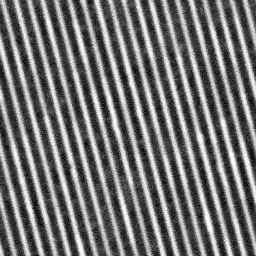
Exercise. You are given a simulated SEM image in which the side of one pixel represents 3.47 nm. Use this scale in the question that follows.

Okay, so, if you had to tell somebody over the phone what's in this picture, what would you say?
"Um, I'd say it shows parallel lines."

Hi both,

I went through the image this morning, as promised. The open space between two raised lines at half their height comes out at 35.2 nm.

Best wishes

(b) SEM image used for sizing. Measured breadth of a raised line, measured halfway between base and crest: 9.7 nanometers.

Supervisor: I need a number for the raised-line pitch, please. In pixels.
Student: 13.1